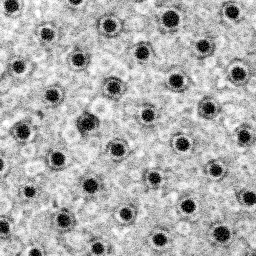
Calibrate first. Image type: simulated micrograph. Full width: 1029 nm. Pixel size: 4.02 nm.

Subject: a regular array of raised bodies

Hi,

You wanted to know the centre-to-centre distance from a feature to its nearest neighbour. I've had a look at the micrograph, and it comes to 170 nm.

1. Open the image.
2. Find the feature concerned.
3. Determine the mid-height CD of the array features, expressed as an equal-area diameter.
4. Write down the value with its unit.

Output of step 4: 69 nanometers